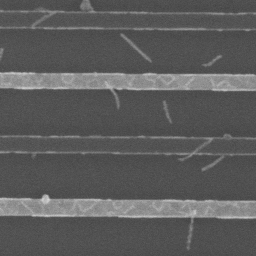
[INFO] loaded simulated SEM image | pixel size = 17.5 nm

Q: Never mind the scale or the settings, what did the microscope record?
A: lines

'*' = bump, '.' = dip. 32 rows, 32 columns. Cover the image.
..........*.....................
********..**....................
********************************
.....***************************
................................
................................
................................
................................
................................
********************************
********************************
................................
................................
................................
................................
................................
................................
********************************
********************************
................................
................................
................................
................................
................................
................................
********************************
********************************
................................
................................
................................
................................
................................